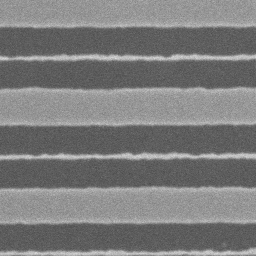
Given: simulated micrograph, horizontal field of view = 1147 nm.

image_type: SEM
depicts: lines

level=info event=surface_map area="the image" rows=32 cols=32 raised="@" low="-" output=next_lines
@@@@@@@@@@@@@@@@@@@@@@@@@@@@@@@@
@@@@@@@@@@@@@@@@@@@@@@@@@@@@@@@@
@@@@@@@@@@@@@@@@@@@@@@@@@@@@@@@@
--------------------------------
--------------------------------
--------------------------------
--------------------------------
--------------------------------
--------------------------------
--------------------------------
--------------------------------
@@@@@@@@@@@@@@@@@@@@@@@@@@@@@@@@
@@@@@@@@@@@@@@@@@@@@@@@@@@@@@@@@
@@@@@@@@@@@@@@@@@@@@@@@@@@@@@@@@
@@@@@@@@@@@@@@@@@@@@@@@@@@@@@@@@
@@@@@@@@@@@@@@@@@@@@@@@@@@@--@-@
--------------------------------
--------------------------------
--------------------------------
---------------@-@@-@@---------@
--------------------------------
--------------------------------
--------------------------------
-----------------@@@@----@@@@@@-
@@@@@@@@@@@@@@@@@@@@@@@@@@@@@@@@
@@@@@@@@@@@@@@@@@@@@@@@@@@@@@@@@
@@@@@@@@@@@@@@@@@@@@@@@@@@@@@@@@
@@@@@@@@@@@@@@@@@@@@@@@@@@@@@@@@
--------------------------------
--------------------------------
--------------------------------
-------@-----@@@--------@------@